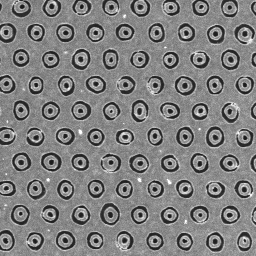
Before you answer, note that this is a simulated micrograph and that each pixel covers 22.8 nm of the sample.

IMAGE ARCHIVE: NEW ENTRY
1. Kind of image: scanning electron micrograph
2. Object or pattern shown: a regular array of ring-shaped grooves with a dot in the middle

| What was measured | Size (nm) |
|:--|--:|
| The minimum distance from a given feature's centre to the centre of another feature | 672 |